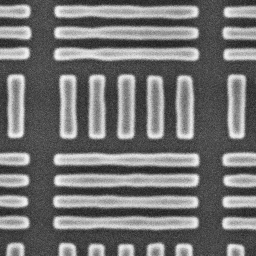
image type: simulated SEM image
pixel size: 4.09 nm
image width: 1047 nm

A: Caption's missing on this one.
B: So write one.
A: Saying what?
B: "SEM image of groups of lines, slits or small figures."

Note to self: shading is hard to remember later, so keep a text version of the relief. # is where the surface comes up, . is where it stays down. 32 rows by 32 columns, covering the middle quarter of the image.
................................
................................
................................
###....###....###.....##.....##.
###....###....###....###.....###
###....###....###....###.....###
###....###....###....####....###
###....###....###....####...####
###....###....###....####...####
###....###....###....####...####
###....###....###....####...####
###....###....###....####...####
###....###....###....####....###
###....###....###....####....###
###....###....###....####....###
###....###....###....####....###
###....###....###....####....###
###....###....###....####....###
................................
................................
................................
................................
................................
################################
################################
................................
................................
................................
################################
################################
................................
................................